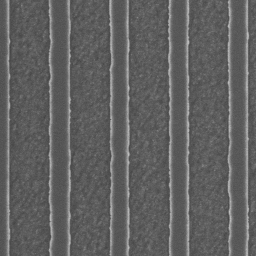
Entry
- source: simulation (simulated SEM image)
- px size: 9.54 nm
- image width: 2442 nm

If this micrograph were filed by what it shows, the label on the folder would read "lines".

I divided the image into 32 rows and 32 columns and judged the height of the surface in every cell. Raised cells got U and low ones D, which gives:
UDDDDDUUUDDDDDUUDDDDDUUUDDDDDUUD
UDDDDDUUUDDDDDUUDDDDDUUUDDDDDUUD
UDDDDDUUUDDDDDUUDDDDDUUUDDDDDUUD
UDDDDDUUUDDDDDUUDDDDDUUDDDDDDUUD
UDDDDDUUUDDDDDUUDDDDDUUDDDDDDUUD
UDDDDDUUUDDDDDUUDDDDDUUUDDDDDUUD
UDDDDDUUUDDDDDUUDDDDDUUDDDDDDUUD
UDDDDDUUUDDDDDUUDDDDDUUDDDDDDUUD
UDDDDDUUUDDDDDUUDDDDDUUDDDDDDUUD
UDDDDDUUUDDDDDUUDDDDDUUUDDDDDUUD
UDDDDDUUUDDDDDUUDDDDDUUUDDDDDUUD
UDDDDDUUUDDDDDUUDDDDDUUUDDDDDUUD
UDDDDDUUUDDDDDUUDDDDDUUUDDDDDUUD
UDDDDDUUUDDDDDUUDDDDDUUUDDDDDUUD
UDDDDDUUUDDDDDUUDDDDDUUUDDDDDUUD
UDDDDDUUUDDDDDUUDDDDDUUUDDDDDUUD
UDDDDDUUUDDDDDUUDDDDDUUUDDDDDUUD
UDDDDDUUUDDDDDUUDDDDDUUUDDDDDUUD
UDDDDDUUUDDDDDUUDDDDDUUUDDDDDUUD
UDDDDDUUUDDDDDUUDDDDDUUDDDDDDUUD
UDDDDDUUUDDDDDUUDDDDDUUUDDDDDUUD
UDDDDDUUUDDDDDUUDDDDDUUUDDDDDUUD
UDDDDDUUUDDDDDUUDDDDDUUUDDDDDUUD
UDDDDDUUUDDDDDUUDDDDDUUUDDDDDUUD
UDDDDDUUUDDDDDUUDDDDDUUUDDDDDUUD
UDDDDDUUUDDDDDUUDDDDDUUUDDDDDUUD
UDDDDDUUUDDDDDUUDDDDDUUUDDDDDUUD
UDDDDDUUUDDDDDUUDDDDDUUUDDDDDUUD
UDDDDDUUUDDDDDUUDDDDDUUUDDDDDUUD
UDDDDDUUUDDDDDUUDDDDDUUUDDDDDUUD
UDDDDDUUUDDDDDUUDDDDDUUUDDDDDUUD
UDDDDDUUUDDDDDUUDDDDDUUUDDDDDUUD